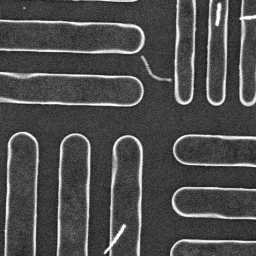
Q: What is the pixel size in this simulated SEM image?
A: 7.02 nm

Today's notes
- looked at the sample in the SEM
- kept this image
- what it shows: groups of lines, slits or small figures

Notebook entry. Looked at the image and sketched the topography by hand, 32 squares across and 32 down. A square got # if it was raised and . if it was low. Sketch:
......................##..##..##
......................##..##..##
......................##..##..##
#################.....##..##..##
##################....##..##..##
##################....##..##..##
..........##...##.....##..##..##
......................##..##..##
......................##..##..##
############..........##..##..##
##################....##..##..##
##################....##..##..##
##################....##..##..##
................................
................................
................................
................................
.###....###....##.....##########
.####...###...####....##########
.####...###...####....##########
.####..####...####......########
.####..####...####..............
.####..####...####..............
.###...####...####..............
.###...####...####....##########
.###...####...####....##########
.###...####...####....##########
.###...####...####..............
.###...####...####..............
.###...####...###...............
.###...####...###.....##########
.###...####...###....###########